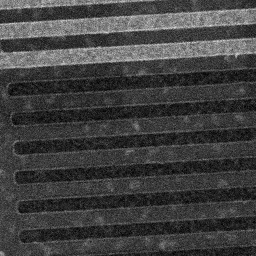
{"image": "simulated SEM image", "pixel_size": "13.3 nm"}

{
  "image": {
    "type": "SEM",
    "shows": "parallel lines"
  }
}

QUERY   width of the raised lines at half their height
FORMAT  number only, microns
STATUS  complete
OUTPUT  0.19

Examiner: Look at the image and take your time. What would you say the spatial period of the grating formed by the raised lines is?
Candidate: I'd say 29.4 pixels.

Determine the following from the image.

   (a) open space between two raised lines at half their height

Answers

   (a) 198 nm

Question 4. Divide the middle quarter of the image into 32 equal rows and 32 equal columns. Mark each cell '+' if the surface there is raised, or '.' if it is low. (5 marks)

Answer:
................................
................................
........................++++++++
.......+++++++++++++++++++++++++
++++++++++++++++++++++++++++++++
++++++++++++++++++++++++++++++++
++++++++++++++++................
................................
................................
...............................+
...............+++++++++++++++++
++++++++++++++++++++++++++++++++
++++++++++++++++++++++++++++++++
+++++++++++++++++++++...........
++++............................
.................++.............
................................
...................+++++++++++++
...+++++++++++++++++++++++++++++
++++++++++++++++++++++++++++++++
+++++++++++++++++++++++++.......
+++++++++.......................
................................
................................
..........................++++++
..........++++++++++++++++++++++
++++++++++++++++++++++++++++++++
++++++++++++++++++++++++++++++++
++++++++++++++++................
................................
................................
...............................+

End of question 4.